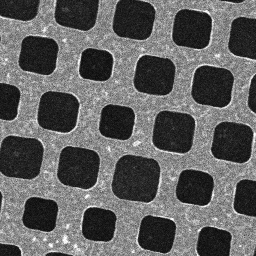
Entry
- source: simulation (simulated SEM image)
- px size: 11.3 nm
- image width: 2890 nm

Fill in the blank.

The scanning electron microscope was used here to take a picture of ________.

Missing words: a regular array of holes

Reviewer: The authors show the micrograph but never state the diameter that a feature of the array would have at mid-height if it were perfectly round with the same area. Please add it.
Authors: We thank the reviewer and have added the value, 467 nanometres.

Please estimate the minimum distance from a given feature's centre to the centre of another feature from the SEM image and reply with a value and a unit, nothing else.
665 nm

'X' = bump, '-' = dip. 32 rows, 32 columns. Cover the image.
-----XX-----XXX----XXXXXXXXXXXXX
-----XX-----XX-----XXX---XXXXXXX
XX--XXX-----XX-----XXX----XXX---
XXXXXXXXX--XXX-----XXX----XXX---
XXXXXXXXXXXXXXX----XXX----XXX---
XXX----XXXXXXXXXXXXXXX----XXX---
XXX----XXX----XXXXXXXXXXXXXXX---
XX-----XXX----XXX----XXXXXXXXXXX
XXX----XXX----XXX-----XXX--XXXXX
XXXXXXXXXX----XXX-----XX-----XXX
-XXXXXXXXXXXXXXXX-----XX-----XX-
--XXXX-XXXXXXXXXXX---XXX-----XX-
--XXX-----XXXXXXXXXXXXXX-----XX-
--XXX-----XXX---XXXXXXXXXXXXXXX-
--XXX-----XXX----XXX----XXXXXXXX
XXXXX-----XX-----XX-----XXX---XX
XXXXXXXX-XXXX----XX-----XXX-----
-----XXXXXXXXXX-XXX-----XXX-----
-----XXX--XXXXXXXXXX----XX-----X
-----XX-----XXX---XXXXXXXXX----X
-----XX-----XXX-----XXXXXXXXXXXX
-----XX-----XX------XXX---XXXXXX
XXXXXXX-----XX------XX-----XXX-X
XXXXXXXXXX-XXX------XX-----XX---
XXXXXXXXXXXXXXX----XXX-----XX---
XXX----XXXXXXXXXXXXXXXX---XXX---
XXX----XXXX---XXXXXXXXXXXXXXXX--
XXX----XXX-----XXX---XXXXXXXXXXX
XXX----XXX----XXX-----XXX--XXXXX
XXXXXXXXXX----XXX-----XXX----XXX
XXXXXXXXXXXXXXXXX-----XXX----XXX
---XXXXXXXXXXXXXXXX--XXXX----XXX